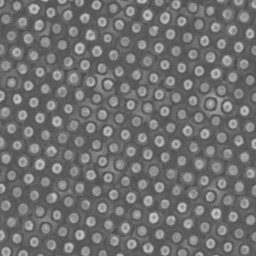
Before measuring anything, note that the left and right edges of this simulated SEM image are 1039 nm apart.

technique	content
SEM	a regular array of raised bodies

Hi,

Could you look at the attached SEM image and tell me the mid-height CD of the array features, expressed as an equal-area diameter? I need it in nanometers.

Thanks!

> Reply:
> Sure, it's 35.5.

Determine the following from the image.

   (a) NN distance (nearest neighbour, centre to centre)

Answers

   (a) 17 pixels